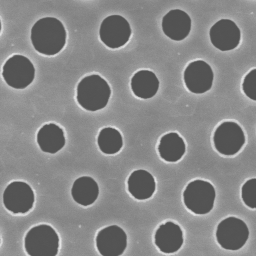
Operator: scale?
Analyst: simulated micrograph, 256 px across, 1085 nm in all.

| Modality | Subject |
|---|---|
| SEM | a regular array of holes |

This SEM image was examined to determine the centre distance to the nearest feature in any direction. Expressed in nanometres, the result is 214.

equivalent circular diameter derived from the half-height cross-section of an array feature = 130 nanometres